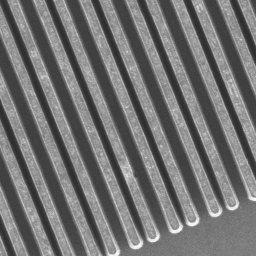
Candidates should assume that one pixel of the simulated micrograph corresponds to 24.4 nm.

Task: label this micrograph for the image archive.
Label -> parallel lines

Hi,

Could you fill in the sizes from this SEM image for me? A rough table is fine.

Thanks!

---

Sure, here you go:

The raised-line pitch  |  521 nanometers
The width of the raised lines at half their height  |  0.272 micrometres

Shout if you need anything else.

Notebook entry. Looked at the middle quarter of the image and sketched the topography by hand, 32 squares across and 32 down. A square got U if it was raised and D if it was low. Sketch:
UUDDUUUDDDUUUDDUUUDDDDUUUDDUUUDD
UUDDUUUDDDDUUUDDUUUDDDUUUDDUUUDD
UUUDDUUUDDDUUUDDUUUDDDDUUUDDUUUD
UUUDDUUUDDDUUUDDUUUDDDDUUUDDUUUD
UUUDDUUUDDDDUUUDDUUUDDDDUUDDUUUD
DUUUDDUUUDDDUUUDDUUUDDDDUUUDDUUU
DUUUDDUUUDDDDUUUDDUUUDDDUUUDDUUU
DDUUUDDUUUDDDUUUDDUUUDDDDUUUDDUU
DDUUUDDUUUDDDUUUDDUUUDDDDUUUDDUU
DDUUUDDUUUDDDDUUUDDUUUDDDDUUDDUU
DDDUUUDDUUUDDDUUUDDUUUDDDDUUUDDU
DDDUUUDDUUUDDDDUUUDDUUUDDDUUUDDU
DDDDUUUDDUUUDDDUUUDDUUUDDDDUUUDD
DDDDUUUDDUUUDDDUUUDDUUUDDDDUUUDD
UDDDUUUDDUUUDDDDUUUDDUUUDDDDUUDD
UDDDDUUUDDUUUDDDUUUDDUUUDDDDUUUD
UUDDDUUUDDUUUDDDDUUUDDUUUDDDUUUD
UUDDDDUUUDDUUUDDDUUUDDUUUDDDDUUU
UUDDDDUUUDDUUUDDDUUUUDUUUDDDDUUU
UUUDDDUUUDDUUUDDDDUUUDDUUUDDDDUU
UUUDDDDUUUDDUUUDDDUUUDDUUUDDDDUU
DUUDDDDUUUDDUUUDDDDUUUDDUUUDDDUU
DUUUDDDDUUUDDUUUDDDUUUDDUUUDDDDU
DDUUDDDDUUUDDUUUDDDUUUDDUUUDDDDU
DDUUUDDDUUUDDUUUDDDDUUUDDUUUDDDD
DDUUUDDDDUUUDDUUUDDDUUUDDUUUDDDD
UDDUUUDDDUUUDDUUUDDDDUUUDDUUUDDD
UDDUUUDDDDUUUDDUUDDDDUUUDDUUUDDD
UDDDUUDDDDUUUDDUUUDDDUUUUDUUUDDD
UUDDUUUDDDUUUDDUUUDDDDUUUDDUUUDD
UUDDUUUDDDDUUUDDUUUDDDUUUDDUUUDD
UUUDDUUDDDDUUUDDUUUDDDDUUUDDUUUD